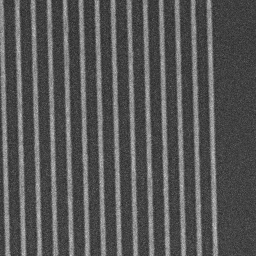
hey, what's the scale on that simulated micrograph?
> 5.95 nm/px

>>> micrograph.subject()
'parallel lines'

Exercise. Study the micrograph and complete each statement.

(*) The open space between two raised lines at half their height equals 0.0766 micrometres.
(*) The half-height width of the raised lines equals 0.0178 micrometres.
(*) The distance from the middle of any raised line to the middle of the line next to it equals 95.1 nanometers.